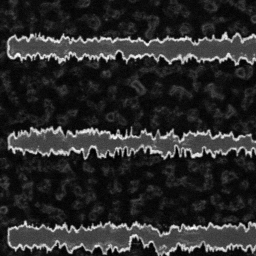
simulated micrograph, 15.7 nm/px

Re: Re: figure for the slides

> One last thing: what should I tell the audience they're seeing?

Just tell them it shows one or a few lines or trenches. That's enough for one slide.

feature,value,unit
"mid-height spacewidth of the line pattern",1180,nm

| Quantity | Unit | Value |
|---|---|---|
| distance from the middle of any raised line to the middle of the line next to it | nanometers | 1480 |